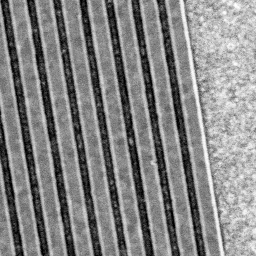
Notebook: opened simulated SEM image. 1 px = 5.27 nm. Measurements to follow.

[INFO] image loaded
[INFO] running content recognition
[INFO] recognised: parallel lines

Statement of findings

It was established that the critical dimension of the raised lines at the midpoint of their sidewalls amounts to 0.08 µm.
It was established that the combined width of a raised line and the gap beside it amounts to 0.136 µm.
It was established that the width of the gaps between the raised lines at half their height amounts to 56.6 nm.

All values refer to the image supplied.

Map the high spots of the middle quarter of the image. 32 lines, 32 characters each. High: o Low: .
..oooo...ooo...oooo...oooo..oooo
..oooo...oooo..oooo...oooo..oooo
...ooo...oooo..oooo...oooo...ooo
...ooo...oooo...oooo..oooo...ooo
...oooo..oooo...oooo..oooo...ooo
...oooo..oooo...oooo..oooo...ooo
...oooo...ooo...oooo...oooo..ooo
...oooo...oooo..oooo...oooo..ooo
o..oooo...oooo..oooo...oooo..ooo
o..oooo...oooo...ooo...oooo...oo
o...oooo..oooo...oooo..oooo...oo
o...oooo...ooo...oooo..oooo...oo
o...oooo...ooo...oooo...oooo..oo
oo..oooo...oooo..oooo...oooo..oo
oo..oooo...oooo..oooo...oooo..oo
oo...ooo...oooo...ooo...oooo...o
oo...ooo...oooo...oooo..oooo...o
oo...oooo..oooo...oooo..oooo...o
oo...oooo...ooo...oooo...ooo...o
oo...oooo...oooo..oooo...oooo..o
ooo..oooo...oooo..oooo...oooo..o
ooo...ooo...oooo...ooo...oooo...
ooo...ooo...oooo...oooo..oooo...
ooo...oooo..oooo...oooo..oooo...
ooo...oooo...ooo...oooo..oooo...
ooo...oooo...ooo...oooo...oooo..
oooo..oooo...oooo..oooo...oooo..
oooo...ooo...oooo..oooo...oooo..
oooo...ooo...oooo...oooo..oooo..
oooo...oooo..oooo...oooo..oooo..
oooo...oooo..oooo...oooo..oooo..
.oooo..oooo...ooo...oooo...ooo..